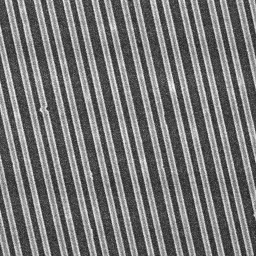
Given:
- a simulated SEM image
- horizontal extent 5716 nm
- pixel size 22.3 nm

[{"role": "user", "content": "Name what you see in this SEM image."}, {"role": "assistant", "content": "parallel lines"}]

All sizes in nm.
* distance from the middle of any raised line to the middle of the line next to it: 315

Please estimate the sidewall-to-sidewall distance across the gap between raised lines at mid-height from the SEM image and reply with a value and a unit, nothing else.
0.159 µm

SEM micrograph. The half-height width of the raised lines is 125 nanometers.